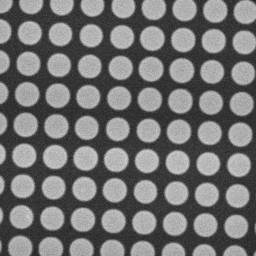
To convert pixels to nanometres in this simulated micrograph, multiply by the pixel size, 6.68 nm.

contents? an array of small figures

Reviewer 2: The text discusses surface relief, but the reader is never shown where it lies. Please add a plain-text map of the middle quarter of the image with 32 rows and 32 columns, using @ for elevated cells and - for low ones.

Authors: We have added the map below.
@@--@@@@@--@@@@@@--@@@@@@--@@@@@
@---@@@@@--@@@@@@--@@@@@@-@@@@@@
@---@@@@@---@@@@@--@@@@@@-@@@@@@
-------------@@@----@@@@---@@@@@
----------------------------@@--
-----@@-------------------------
@---@@@@----@@@@----@@@-----@@--
@--@@@@@@--@@@@@@--@@@@@---@@@@@
@--@@@@@@--@@@@@@-@@@@@@--@@@@@@
@--@@@@@@--@@@@@@-@@@@@@--@@@@@@
----@@@@---@@@@@---@@@@@--@@@@@@
--------------------@@@----@@@@-
--------------------------------
----@@@-------------------------
@--@@@@@---@@@@@---@@@@----@@@--
@--@@@@@@--@@@@@--@@@@@@--@@@@@-
@--@@@@@@--@@@@@--@@@@@@--@@@@@@
---@@@@@---@@@@@--@@@@@@--@@@@@@
----@@@-----@@@----@@@@---@@@@@-
--------------------@@-----@@@--
--------------------------------
---@@@@@---@@@@-----@@----------
@--@@@@@--@@@@@@--@@@@@---@@@@@-
@-@@@@@@--@@@@@@--@@@@@@--@@@@@-
--@@@@@@--@@@@@@--@@@@@@--@@@@@-
---@@@@@--@@@@@---@@@@@---@@@@@-
-----@@----@@@@----@@@@---@@@@@-
---------------------------@@---
----@@--------------------------
---@@@@---@@@@@----@@@-----@----
--@@@@@@--@@@@@---@@@@@---@@@@@-
--@@@@@@--@@@@@@--@@@@@--@@@@@@-